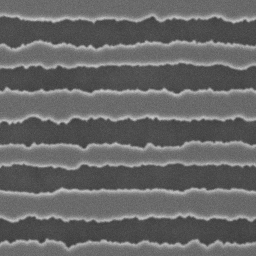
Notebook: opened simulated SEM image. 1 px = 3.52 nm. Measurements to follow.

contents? lines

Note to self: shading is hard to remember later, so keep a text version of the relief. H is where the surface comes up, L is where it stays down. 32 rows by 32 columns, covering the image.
HHHHHHHHHHHHHHHHHHHHHHHHHHHHHHHH
HHHHHHHHHHHHHHHHHHHHHHHHHHHHHHHH
LLLHHHHHLLLHLLLLHHLLHLLLLLLLHHHH
LLLLLLLLLLLLLLLLLLLLLLLLLLLLLLLL
LLLLLLLLLLLLLLLLLLLLLLLLLLLLLLLL
LLLLHHHHHLLLLLLLLHHHHHHHHHHHHHLL
HHHHHHHHHHHHHHHHHHHHHHHHHHHHHHHH
HHHHHHHHHHHHHHHHHHHHHHHHHHHHHHHH
HHLLLLHLHLLLLLLLLLLLLLLLLLLLLHHL
LLLLLLLLLLLLLLLLLLLLLLLLLLLLLLLL
LLLLLLLLLLLLLLLLLLLLLLLLLLLLLLLL
HHHHHHHHHHHLHHHHHHHHHLLHHHHHHHHH
HHHHHHHHHHHHHHHHHHHHHHHHHHHHHHHH
HHHHHHHHHHHHHHHHHHHHHHHHHHHHHHHH
HHHHHHHHHHHHHHHHHHHHHHHHHHHHHHHH
LLLLLLLLLLLLLLLLLLLLLLLLLLLLLLLL
LLLLLLLLLLLLLLLLLLLLLLLLLLLLLLLL
LLLLLLLLLLLLLLLLLLLLLLLLLLLLLLLL
HHHHHHHHHHHHHHHHHHHHHHHHHHHHHHHH
HHHHHHHHHHHHHHHHHHHHHHHHHHHHHHHH
HHHHHHHHHHHHHHHHHHHHHLLHHHHHHHHH
LLLLLLLLLLLLLLLLLLLLLLLLLLLLLLLL
LLLLLLLLLLLLLLLLLLLLLLLLLLLLLLLL
LLLLLLLLLLLLLLLLLLLLLLLLLLLLLLLL
HHHHHHHHHHHHHHHHHHHHHHHHHHHHHHHH
HHHHHHHHHHHHHHHHHHHHHHHHHHHHHHHH
HHHHHHHHHHHHHHHHHHHHHHHHHHHHHHHH
LHHLLLLLHLHHHHLLLLLLLLLLLLLLHLLH
LLLLLLLLLLLLLLLLLLLLLLLLLLLLLLLL
LLLLLLLLLLLLLLLLLLLLLLLLLLLLLLLL
HHHHHHHHLLHHHHHHHHHHHLLHHLHHHHHH
HHHHHHHHHHHHHHHHHHHHHHHHHHHHHHHH